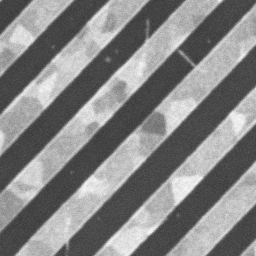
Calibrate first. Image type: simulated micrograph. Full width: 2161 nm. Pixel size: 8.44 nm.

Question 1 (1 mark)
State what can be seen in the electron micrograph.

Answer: lines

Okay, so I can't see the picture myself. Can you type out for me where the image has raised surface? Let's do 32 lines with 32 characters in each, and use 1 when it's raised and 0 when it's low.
00001111100001111100000111100000
00011111000011111000001111000001
00111110000111110000011110000011
01111100001111100000111100000111
11111000001111000001111000001111
11110000011110000011110000011111
11100000111100000111110000111110
11000001111000001111100001111100
10000011110000011111000011111000
00000111110000111110000111110000
00001111100001111100001111100000
00011111000011111000011111000001
00111110000111110000011110000011
01111100001111100000111100000111
11111000011111000001111000000111
11110000111110000011110000001111
11100000111100000111100000011110
11000001111000001111000000111100
10000011110000011111000001111000
00000111100000111110000011110000
00001111000001111100000111100000
00011110000011111000001111000001
00111100000111110000011110000011
01111000001111100000111100000111
11110000011111000001111000001111
11100000111110000011110000011111
11000001111100000111100000111110
10000011111000001111000001111100
00000111110000011111000011111000
00001111100000111110000111110000
00011111000001111000001111100000
00111110000011110000011111000001